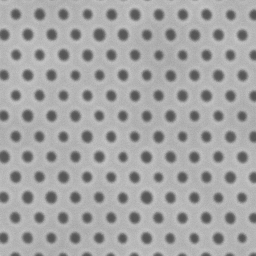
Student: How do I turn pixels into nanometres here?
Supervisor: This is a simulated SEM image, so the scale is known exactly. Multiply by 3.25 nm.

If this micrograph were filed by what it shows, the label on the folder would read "a regular array of holes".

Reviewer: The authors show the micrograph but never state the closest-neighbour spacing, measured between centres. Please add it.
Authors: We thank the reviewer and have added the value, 76 nanometres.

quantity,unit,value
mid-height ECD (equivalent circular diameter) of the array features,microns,0.0357